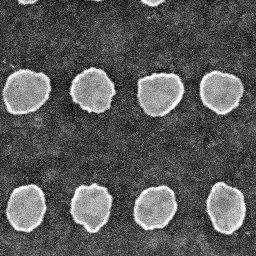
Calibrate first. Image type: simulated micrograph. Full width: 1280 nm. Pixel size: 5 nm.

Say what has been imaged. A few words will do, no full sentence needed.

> a regular array of raised bodies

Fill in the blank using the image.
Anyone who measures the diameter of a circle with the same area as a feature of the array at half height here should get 210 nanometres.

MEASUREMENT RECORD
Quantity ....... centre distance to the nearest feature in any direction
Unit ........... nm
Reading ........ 323